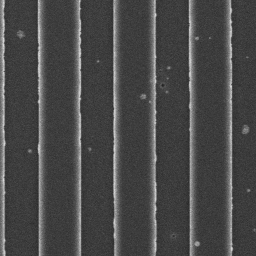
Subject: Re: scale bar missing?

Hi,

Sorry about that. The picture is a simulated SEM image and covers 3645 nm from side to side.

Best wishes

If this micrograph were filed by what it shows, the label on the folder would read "lines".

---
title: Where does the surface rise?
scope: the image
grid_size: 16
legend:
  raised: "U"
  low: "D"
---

DDUUUDDUUUDDUUDD
DDUUUDDUUUDDUUDD
DDUUUDDUUUDDUUDD
DDUUUDDUUUDDUUDD
DDUUUDDUUUDDUUDD
DDUUUDDUUUDDUUDD
DDUUUDDUUUDDUUDD
DDUUUDDUUUDDUUDD
DDUUUDDUUUDDUUDD
DDUUUDDUUUDDUUDD
DDUUUDDUUUDDUUDD
DDUUUDDUUUDDUUDD
DDUUUDDUUUDDUUDD
DDUUUDDUUUDDUUDD
DDUUUDDUUUDDUUDD
DDUUUDDUUUDDUUUD